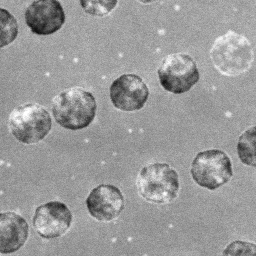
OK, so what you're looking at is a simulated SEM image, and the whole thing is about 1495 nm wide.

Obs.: a regular array of holes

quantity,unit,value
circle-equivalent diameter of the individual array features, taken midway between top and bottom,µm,0.233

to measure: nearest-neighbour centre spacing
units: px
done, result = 53.9